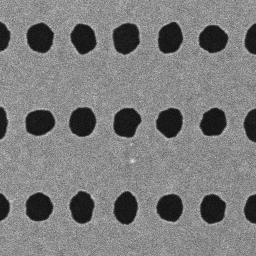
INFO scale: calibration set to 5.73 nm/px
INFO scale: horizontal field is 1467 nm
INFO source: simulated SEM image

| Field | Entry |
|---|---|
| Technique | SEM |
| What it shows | a regular array of holes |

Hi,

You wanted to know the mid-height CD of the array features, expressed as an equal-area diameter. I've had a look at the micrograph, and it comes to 160 nm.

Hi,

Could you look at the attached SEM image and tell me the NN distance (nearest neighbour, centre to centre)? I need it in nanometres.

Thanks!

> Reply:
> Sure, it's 245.